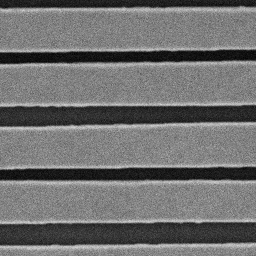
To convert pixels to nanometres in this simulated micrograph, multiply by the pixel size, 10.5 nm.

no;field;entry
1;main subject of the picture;lines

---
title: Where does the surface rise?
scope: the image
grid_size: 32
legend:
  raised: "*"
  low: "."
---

................................
********************************
********************************
********************************
********************************
********************************
................................
................................
********************************
********************************
********************************
********************************
********************************
................................
................................
.....................***********
********************************
********************************
********************************
********************************
********************************
................................
........................*.......
********************************
********************************
********************************
********************************
********************************
................................
................................
...............................*
********************************